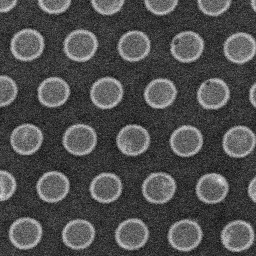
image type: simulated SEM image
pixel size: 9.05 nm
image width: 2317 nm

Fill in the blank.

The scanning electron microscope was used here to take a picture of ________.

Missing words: a regular array of raised bodies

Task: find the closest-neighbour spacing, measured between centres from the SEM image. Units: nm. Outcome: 481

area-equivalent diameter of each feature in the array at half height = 29.5 pixels